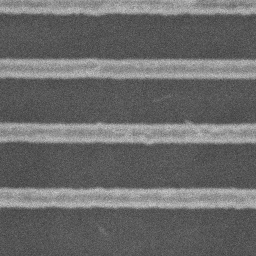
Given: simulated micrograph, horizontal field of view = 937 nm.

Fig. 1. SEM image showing one or a few lines or trenches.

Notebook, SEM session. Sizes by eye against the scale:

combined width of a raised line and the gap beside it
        236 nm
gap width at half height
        50.6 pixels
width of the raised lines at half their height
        51.2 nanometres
